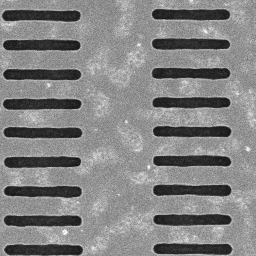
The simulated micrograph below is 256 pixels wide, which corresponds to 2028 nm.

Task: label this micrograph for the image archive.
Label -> a regular array of holes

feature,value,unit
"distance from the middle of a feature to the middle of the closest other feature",0.232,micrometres